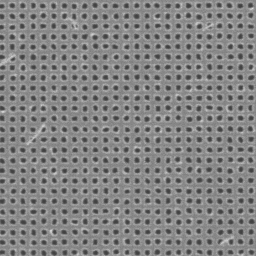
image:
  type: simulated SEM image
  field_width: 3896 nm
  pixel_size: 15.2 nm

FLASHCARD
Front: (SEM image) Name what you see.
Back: a regular array of holes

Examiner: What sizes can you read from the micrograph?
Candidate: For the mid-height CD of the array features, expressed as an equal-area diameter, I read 82.4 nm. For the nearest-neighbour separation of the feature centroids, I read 148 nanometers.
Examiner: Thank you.